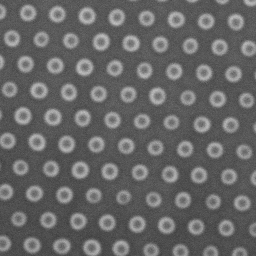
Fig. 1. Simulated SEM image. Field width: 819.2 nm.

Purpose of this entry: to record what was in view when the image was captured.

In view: an array of small figures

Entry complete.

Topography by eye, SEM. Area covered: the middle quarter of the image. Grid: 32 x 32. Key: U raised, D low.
DDDUUUUDDDDUUUDDDDDUUUDDDDUUUDDD
DDDUUUUDDDDUUUDDDDUUUUDDDDUUUDDD
DDDDUUDDDDDDUUDDDDDUUUDDDDUUUDDD
DDDDDDDDDDDDDDDDDDDDDDDDDDDUDDDD
DDDDDDDDDDDDDDDDDDDDDDDDDDDDDDDD
UUDDDDDDDDDDDDDDDDDDDDDDDDDDDDDD
UUUDDDDUUUDDDDDUUUDDDDUUUDDDDDDD
UUUDDDDUUUDDDDUUUUDDDDUUUDDDDDUU
UUUDDDDUUUDDDDUUUUDDDDUUUDDDDUUU
DDDDDDDDDDDDDDDDDDDDDDUUUDDDDDUU
DDDDDDDDDDDDDDDDDDDDDDDDDDDDDDDD
DDDDDDDDDDDDDDDDDDDDDDDDDDDDDDDD
DDDUUUDDDDDUUDDDDDDDDDDDDDDDDDDD
DDDUUUDDDDUUUUDDDDUUUDDDDDUUDDDD
DDDUUUDDDDUUUUDDDDUUUDDDDUUUUDDD
DDDDDDDDDDDUUDDDDDUUUDDDDUUUDDDD
DDDDDDDDDDDDDDDDDDDDDDDDDDDDDDDD
DDDDDDDDDDDDDDDDDDDDDDDDDDDDDDDD
UUDDDDDUUDDDDDDDDDDDDDDDDDDDDDDD
UUDDDDUUUUDDDDUUUDDDDDUUDDDDDDUD
UUDDDDUUUUDDDDUUUDDDDUUUUDDDDUUU
UUDDDDDUUDDDDDUUUDDDDUUUUDDDDUUU
DDDDDDDDDDDDDDDDDDDDDDUUDDDDDUUU
DDDDDDDDDDDDDDDDDDDDDDDDDDDDDDDD
DDDDDDDDDDDDDDDDDDDDDDDDDDDDDDDD
DDUUUUDDDDUUUDDDDDUUDDDDDDDDDDDD
DDUUUUDDDDUUUDDDDUUUUDDDDUUUDDDD
DDUUUUDDDDUUUDDDDUUUUDDDDUUUDDDD
DDDDDDDDDDUUUDDDDDUUDDDDDUUUDDDD
DDDDDDDDDDDDDDDDDDDDDDDDDDDDDDDD
DDDDDDDDDDDDDDDDDDDDDDDDDDDDDDDD
UUDDDDUUDDDDDDDDDDDDDDDDDDDDDDDD